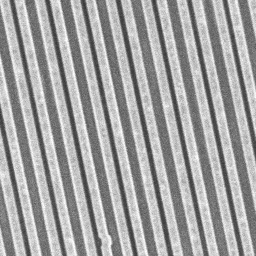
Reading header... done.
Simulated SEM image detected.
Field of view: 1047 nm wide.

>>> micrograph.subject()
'parallel lines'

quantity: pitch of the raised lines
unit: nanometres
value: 70.7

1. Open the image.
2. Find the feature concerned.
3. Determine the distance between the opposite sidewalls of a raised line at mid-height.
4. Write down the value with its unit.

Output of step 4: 36.5 nm